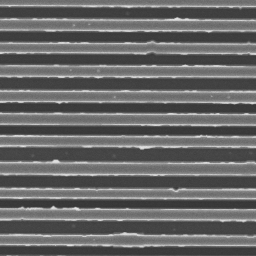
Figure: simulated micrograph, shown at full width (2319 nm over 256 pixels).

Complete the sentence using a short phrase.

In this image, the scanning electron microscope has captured parallel lines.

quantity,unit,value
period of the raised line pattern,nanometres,217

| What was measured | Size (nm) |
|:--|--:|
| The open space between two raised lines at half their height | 94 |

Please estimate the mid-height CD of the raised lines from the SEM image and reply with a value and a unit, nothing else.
13.1 px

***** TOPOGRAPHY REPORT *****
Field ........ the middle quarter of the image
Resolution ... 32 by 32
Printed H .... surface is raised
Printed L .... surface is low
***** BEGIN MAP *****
HHHHHHHHHHHHHHHHHHHHHHHHHHHHHHHH
HHHHHHHHHHHHHHHHHHHHHHHHHHHHHHHH
HHHHHHHHHHHHHHHHHHHHHHHHHHHHHHHH
LLLLLLLLHLLLLLLLLLLLLLLLLLLLLLLL
LLLLLLLLLLLLLLLLLLLLLLLLLLLLLLLL
LLLLLLLLLLLLLLLLLLLLLLLLLLLLLLLL
LLLLLLLLLLLLLLLLLLLLLLLLLLLLLLLL
HHHHHHHHHHHHHHHHHHHHHHHHHHHHHHHH
HHHHHHHHHHHHHHHHHHHHHHHHHHHHHHHH
HHHHHHHHHHHHHHHHHHHHHHHHHHHHHHHH
LLLLLLLLLLLLLLLLLLLLLLLLLLLLLLLL
LLLLLLLLLLLLLLLLLLLLLLLLLLLLLLLL
HHHHHHHHHHHHHHHHHHHHHHHHHHHHHHHH
HHHHHHHHHHHHHHHHHHHHHHHHHHHHHHHH
HHHHHHHHHHHHHHHHHHHHHHHHHHHHHHHH
LLLLLLLLLLLLLLLLLLLLLLLLLLLLLLLL
LLLLLLLLLLLLLLLLLLLLLLLLLLLLLLLL
LLLLLLLLLLLLLLLLLLLLLLLLLLLLLLLL
HHHHHHHHHHHHHHHHHHHHHHHHHHHHHHHH
HHHHHHHHHHHHHHHHHHHHHHHHHHHHHHHH
HHHHHHHHHHHHHHHHHHHHHHHHHHHHHHHH
LLLLLLLLLLLLLLLLLLLLLLLLLLLLLLLL
LLLLLLLLLLLLLLLLLLLLLLLLLLLLLLLL
LLLLLLLLLLLLLLLLLLLLLLLLLLLLLLLL
LLLLLLLLLLLLLLLLLLLLLLLLLLLLLLLL
HHHHHHHHHHHHHHHHHHHHHHHHHHHHHHHH
HHHHHHHHHHHHHHHHHHHHHHHHHHHHHHHH
HHHHHHHHHHHHHHHHHHHHHHHHHHHHHHHH
LLLLLLLLLLLLLLLLLLLLLLLLLLLLLLLL
LLLLLLLLLLLLLLLLLLLLLLLLLLLLLLLL
LLLLLLLLLLLLLLLLLLLLLLLLLLLLLLLL
HHHHHHHHHHHHHHHHHHHHHHHHHHHHHHHH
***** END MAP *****